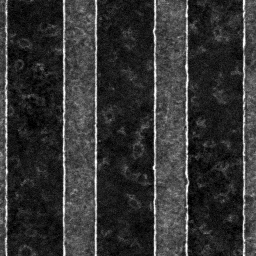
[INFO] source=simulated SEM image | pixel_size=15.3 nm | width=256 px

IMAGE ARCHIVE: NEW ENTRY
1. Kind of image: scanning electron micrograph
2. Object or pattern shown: one or a few lines or trenches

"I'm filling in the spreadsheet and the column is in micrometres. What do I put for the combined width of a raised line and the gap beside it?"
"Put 1.38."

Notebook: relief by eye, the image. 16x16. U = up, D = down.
UUUUDDUUUUDDUUUD
UUUUDDUUUUDDUUUD
UUUUDDUUUUDDUUUD
UUUUDDUUUUDDUUUD
UUUUDDUUUUDDUUUD
UUUUDDUUUUDDUUUD
UUUUDDUUUUDDUUUD
UUUUDDUUUUDDUUUD
UUUUDDUUUUDDUUUD
UUUUDDUUUUDDUUUD
UUUUDDUUUUDDUUUD
UUUUDDUUUUDDUUUD
UUUUDDUUUUDDUUUD
UUUUDDUUUUDDUUUD
UUUUDDUUUUDDUUUD
UUUUDDUUUUDDUUUD